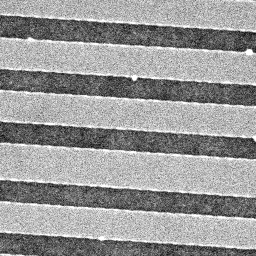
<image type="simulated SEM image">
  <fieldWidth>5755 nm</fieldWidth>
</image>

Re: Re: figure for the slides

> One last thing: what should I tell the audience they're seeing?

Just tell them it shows lines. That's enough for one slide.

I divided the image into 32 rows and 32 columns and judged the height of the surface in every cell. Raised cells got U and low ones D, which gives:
UUUUUUUUUUUUUUUUUUUUUUUUUUUUUUUU
UUUUUUUUUUUUUUUUUUUUUUUUUUUUUUUU
DDDDDDDDDDDUUUUUUUUUUUUUUUUUUUUU
DDDDDDDDDDDDDDDDDDDDDDDDDDUUUUUU
DDDDDDDDDDDDDDDDDDDDDDDDDDDDDDDD
UUUUUUUUUUUUUDDDDDDDDDDDDDDDDDDD
UUUUUUUUUUUUUUUUUUUUUUUUUUUUUUUU
UUUUUUUUUUUUUUUUUUUUUUUUUUUUUUUU
UUUUUUUUUUUUUUUUUUUUUUUUUUUUUUUU
DDDDDDDDDDDDDDDUUUUUUUUUUUUUUUUU
DDDDDDDDDDDDDDDDDDDDDDDDDDDDDDDU
UUDDDDDDDDDDDDDDDDDDDDDDDDDDDDDD
UUUUUUUUUUUUUUUUUUDDDDDDDDDDDDDD
UUUUUUUUUUUUUUUUUUUUUUUUUUUUUUUU
UUUUUUUUUUUUUUUUUUUUUUUUUUUUUUUU
DDDDDUUUUUUUUUUUUUUUUUUUUUUUUUUU
DDDDDDDDDDDDDDDDDDDDDUUUUUUUUUUU
DDDDDDDDDDDDDDDDDDDDDDDDDDDDDDDD
UUUUUUUUUDDDDDDDDDDDDDDDDDDDDDDD
UUUUUUUUUUUUUUUUUUUUUUUUDDDDDDDD
UUUUUUUUUUUUUUUUUUUUUUUUUUUUUUUU
UUUUUUUUUUUUUUUUUUUUUUUUUUUUUUUU
DUUUUUUUUUUUUUUUUUUUUUUUUUUUUUUU
DDDDDDDDDDDDDDDDUUUUUUUUUUUUUUUU
DDDDDDDDDDDDDDDDDDDDDDDDDDDDDDUU
UUUDDDDDDDDDDDDDDDDDDDDDDDDDDDDD
UUUUUUUUUUUUUUUUUUDDDDDDDDDDDDDD
UUUUUUUUUUUUUUUUUUUUUUUUUUUUUUUU
UUUUUUUUUUUUUUUUUUUUUUUUUUUUUUUU
DDDDDDDUUUUUUUUUUUUUUUUUUUUUUUUU
DDDDDDDDDDDDDDDDDDDDDDDUUUUUUUUU
DDDDDDDDDDDDDDDDDDDDDDDDDDDDDDDD